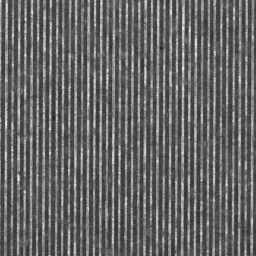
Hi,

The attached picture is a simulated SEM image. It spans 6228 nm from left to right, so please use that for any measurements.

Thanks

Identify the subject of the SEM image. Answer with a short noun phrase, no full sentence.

parallel lines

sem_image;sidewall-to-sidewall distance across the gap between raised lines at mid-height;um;0.113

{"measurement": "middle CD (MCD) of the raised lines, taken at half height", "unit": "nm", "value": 45.6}